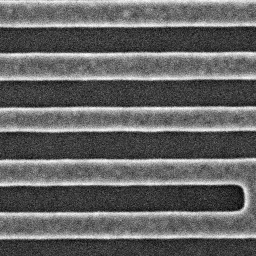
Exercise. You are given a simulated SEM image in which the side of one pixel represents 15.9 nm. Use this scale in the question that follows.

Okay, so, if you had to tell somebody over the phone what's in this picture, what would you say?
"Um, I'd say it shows wiring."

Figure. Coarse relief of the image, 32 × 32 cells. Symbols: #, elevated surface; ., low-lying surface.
################################
################################
################################
................................
................................
................................
................................
################################
################################
################################
................................
................................
................................
........................########
################################
################################
................................
................................
................................
................................
################################
################################
################################
..............................##
...............................#
...............................#
.............................###
################################
################################
################################
................................
................................